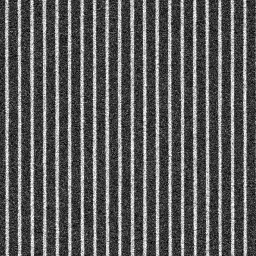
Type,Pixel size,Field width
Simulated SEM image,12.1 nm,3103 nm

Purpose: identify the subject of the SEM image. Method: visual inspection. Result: parallel lines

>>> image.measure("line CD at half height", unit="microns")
0.0333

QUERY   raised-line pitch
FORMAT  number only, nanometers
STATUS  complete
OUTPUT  152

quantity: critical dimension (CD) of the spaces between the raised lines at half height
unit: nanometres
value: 120